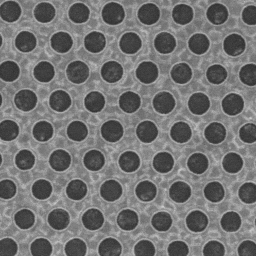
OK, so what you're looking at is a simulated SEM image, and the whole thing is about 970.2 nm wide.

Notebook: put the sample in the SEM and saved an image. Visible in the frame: a regular array of holes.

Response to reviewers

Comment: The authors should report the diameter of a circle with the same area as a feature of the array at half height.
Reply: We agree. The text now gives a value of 87.6 nm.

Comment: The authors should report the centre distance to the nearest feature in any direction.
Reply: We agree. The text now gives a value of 0.128 micrometres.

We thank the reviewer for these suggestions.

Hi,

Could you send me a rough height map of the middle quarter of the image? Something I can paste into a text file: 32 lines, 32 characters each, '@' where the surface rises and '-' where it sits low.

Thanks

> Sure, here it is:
@-----@@@------@@@-----@@@@----@
-------@@------@@@------@@------
------@@@------@@@------@@------
@-----@@@------@@@------@@@-----
@@---@@@@@---@@@@@@----@@@@----@
@@@@@@@@@@@@@@@@@@@@@@@@@@@@@@@@
@@@@@@@@@@@@@@@@@@@@@@@@@@@@@@@@
-@@@@@----@@@@-----@@@@----@@@@@
--@@@-----@@@@-----@@@------@@@-
--@@@------@@------@@@------@@@-
--@@@-----@@@@-----@@@------@@@-
-@@@@@----@@@@----@@@@@----@@@@-
@@@@@@@@@@@@@@@@-@@@@@@@--@@@@@@
@@@@@@@@@@@@@@@@@@@@@@@@@@@@@@@@
@@---@@@@@----@@@@@---@@@@@@--@@
@-----@@@------@@@-----@@@@-----
------@@@------@@@------@@------
@-----@@@------@@@------@@------
@-----@@@@-----@@@-----@@@@-----
@@@-@@@@@@@--@@@@@@---@@@@@@---@
@@@@@@@@@@@@@@@@@@@@@@@@@@@@@@@@
@@@@@@---@@@@@@@@@@@@@@@@@@@@@@@
-@@@@-----@@@@-----@@@@----@@@@@
--@@@-----@@@@-----@@@------@@@-
--@@@-----@@@------@@@------@@@-
--@@@-----@@@@-----@@@-----@@@@-
-@@@@@---@@@@@----@@@@@----@@@@-
@@@@@@@@@@@@@@@@@@@@@@@@@@@@@@@@
@@@@@@@@@@@@@@@@@@@@@@@@@@@@@@@@
@----@@@@@----@@@@@---@@@@@@--@@
------@@@------@@@-----@@@@-----
------@@@------@@@------@@------